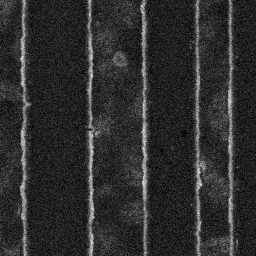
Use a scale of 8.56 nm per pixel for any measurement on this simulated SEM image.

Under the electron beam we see one or a few lines or trenches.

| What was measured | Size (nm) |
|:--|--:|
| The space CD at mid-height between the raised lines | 506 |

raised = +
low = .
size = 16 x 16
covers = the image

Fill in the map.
+.....+++...++..
+.....+++...++..
+.....+++...++..
+.....+++...++..
+.....+++...++..
++....+++...++..
++....+++...++..
++....+++...++..
++....+++...++..
++....+++...++..
++....+++...++..
++....+++...++..
++....+++...++..
++....+++...++..
++....+++...++..
++....+++...++..